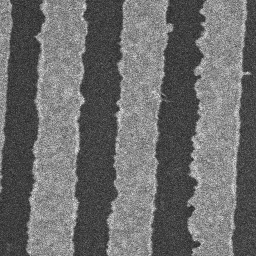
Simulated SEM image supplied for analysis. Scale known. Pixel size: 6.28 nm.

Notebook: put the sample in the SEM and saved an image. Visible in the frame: one or a few lines or trenches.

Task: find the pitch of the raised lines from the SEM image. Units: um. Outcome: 0.501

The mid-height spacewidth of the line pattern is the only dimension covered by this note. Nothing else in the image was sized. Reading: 233 nanometres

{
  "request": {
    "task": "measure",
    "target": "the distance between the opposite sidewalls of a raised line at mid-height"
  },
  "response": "40.9 pixels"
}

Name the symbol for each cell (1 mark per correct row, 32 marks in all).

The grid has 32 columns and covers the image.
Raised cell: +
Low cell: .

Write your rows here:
+....++++++....++++++.....+++++.
+....+++++.....++++++....++++++.
+.....+++++....++++++.....+++++.
+....++++++....++++++.....++++..
+....++++++....++++++....+++++..
+....++++++....++++++....+++++..
+....+++++.....+++++.....+++++..
+....+++++.....+++++.....+++++..
+....+++++.....++++++....+++++..
+....+++++.....+++++.....+++++..
+....+++++.....+++++....++++++..
+....+++++.....+++++.....+++++..
+....+++++.....+++++.....+++++..
+....+++++.....+++++.....+++++..
+....+++++.....+++++.....+++++..
+....+++++.....+++++.....+++++..
.....+++++.....+++++.....+++++..
.....+++++.....+++++....++++++..
....++++++.....++++.....++++++..
....++++++.....++++.....++++++..
....+++++.....++++++....+++++...
....+++++......++++.....+++++...
.....+++++....+++++......++++...
....+++++......+++++.....++++...
....+++++......++++.....+++++...
....++++++....+++++.....+++++...
....++++++....+++++.....+++++...
....+++++.....+++++.....+++++...
....+++++.....+++++.....+++++...
....+++++.....+++++.....+++++...
....+++++....++++++......++++...
....+++++....++++++.....+++++...